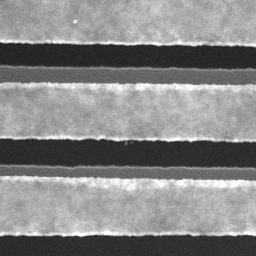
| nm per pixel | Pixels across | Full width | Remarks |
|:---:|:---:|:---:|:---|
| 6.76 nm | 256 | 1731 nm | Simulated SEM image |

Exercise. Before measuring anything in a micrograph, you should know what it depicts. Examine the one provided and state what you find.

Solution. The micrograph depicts lines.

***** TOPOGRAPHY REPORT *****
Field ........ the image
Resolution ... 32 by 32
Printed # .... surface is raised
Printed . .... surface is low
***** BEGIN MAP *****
################################
################################
################################
################################
################################
....#....#######################
................................
................................
#########..##...................
################################
################################
################################
################################
################################
################################
################################
################################
..............##.#.######.######
................................
................................
................................
################################
################################
################################
################################
################################
################################
################################
################################
................................
................................
................................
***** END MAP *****